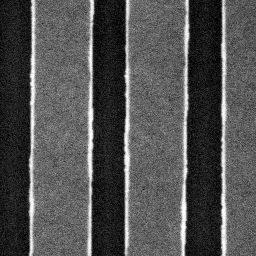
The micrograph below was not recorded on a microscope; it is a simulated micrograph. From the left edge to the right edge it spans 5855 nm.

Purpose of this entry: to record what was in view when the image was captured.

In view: lines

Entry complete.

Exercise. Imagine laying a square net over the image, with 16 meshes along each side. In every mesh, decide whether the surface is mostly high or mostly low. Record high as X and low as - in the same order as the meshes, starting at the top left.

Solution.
--XXXX--XXXX--XX
--XXXX--XXXX--XX
--XXXX--XXXX--XX
--XXXX--XXXX--XX
--XXXX--XXXX--XX
--XXXX--XXXX--XX
--XXXX--XXXX--XX
--XXXX--XXXX--XX
--XXXX--XXXX--XX
--XXXX--XXXX--XX
--XXXX--XXXX--XX
--XXXX--XXXX--XX
--XXXX--XXXX--XX
--XXXX--XXX---XX
--XXXX--XXX---XX
--XXXX--XXX---XX